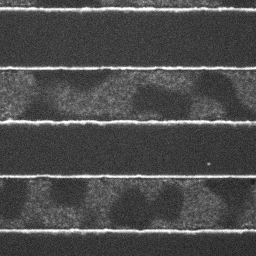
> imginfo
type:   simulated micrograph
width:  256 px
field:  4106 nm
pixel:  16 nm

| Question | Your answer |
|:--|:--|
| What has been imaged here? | lines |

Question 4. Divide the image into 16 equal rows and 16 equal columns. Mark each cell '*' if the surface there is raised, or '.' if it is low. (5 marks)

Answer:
................
****************
****************
****************
................
................
................
................
****************
****************
****************
................
................
................
****************
****************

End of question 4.